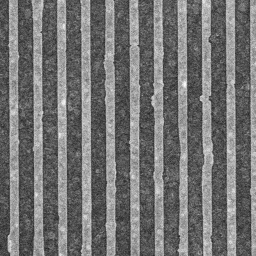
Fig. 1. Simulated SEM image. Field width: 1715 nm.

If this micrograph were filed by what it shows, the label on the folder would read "parallel lines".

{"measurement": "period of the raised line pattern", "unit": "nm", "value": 161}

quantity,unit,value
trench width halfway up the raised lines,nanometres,101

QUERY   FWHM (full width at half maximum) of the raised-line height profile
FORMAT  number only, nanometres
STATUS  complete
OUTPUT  58.6